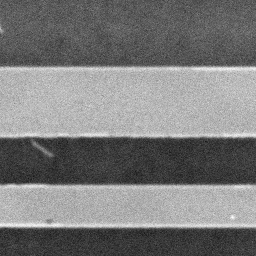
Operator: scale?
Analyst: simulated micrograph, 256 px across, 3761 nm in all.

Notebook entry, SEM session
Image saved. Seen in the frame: lines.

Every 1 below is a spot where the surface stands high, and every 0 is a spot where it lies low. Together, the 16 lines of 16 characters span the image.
0000000000000000
0000000000000000
0000000000000000
0000000000000000
1111111111111111
1111111111111111
1111111111111111
1111111111111111
0000000000110000
0000000000000000
0000000000000000
0000000000000000
1111111111111111
1111111111111111
0000000000000000
0000000000000000